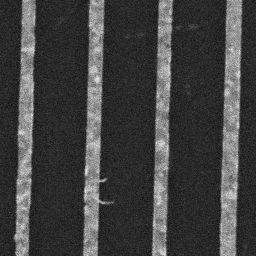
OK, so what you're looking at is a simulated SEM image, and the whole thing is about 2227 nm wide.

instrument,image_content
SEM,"one or a few lines or trenches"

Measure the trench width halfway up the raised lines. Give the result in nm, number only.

482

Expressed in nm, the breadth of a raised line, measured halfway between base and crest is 116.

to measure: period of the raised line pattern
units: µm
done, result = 0.596